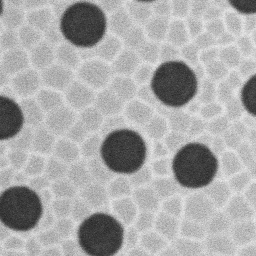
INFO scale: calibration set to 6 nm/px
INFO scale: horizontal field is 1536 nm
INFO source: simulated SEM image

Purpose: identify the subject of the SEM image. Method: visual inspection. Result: holes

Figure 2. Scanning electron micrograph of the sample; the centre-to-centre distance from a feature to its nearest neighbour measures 470 nm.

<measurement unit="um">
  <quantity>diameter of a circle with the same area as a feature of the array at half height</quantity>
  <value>0.269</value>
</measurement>